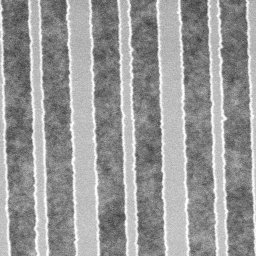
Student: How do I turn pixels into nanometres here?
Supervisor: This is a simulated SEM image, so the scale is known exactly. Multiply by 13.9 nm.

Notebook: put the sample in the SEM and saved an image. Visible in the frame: parallel lines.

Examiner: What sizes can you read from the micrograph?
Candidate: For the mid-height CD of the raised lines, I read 404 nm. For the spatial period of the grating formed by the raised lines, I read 610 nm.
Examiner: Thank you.